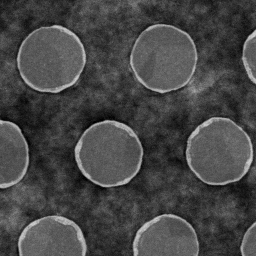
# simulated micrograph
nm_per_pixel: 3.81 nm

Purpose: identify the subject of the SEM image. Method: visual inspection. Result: raised bodies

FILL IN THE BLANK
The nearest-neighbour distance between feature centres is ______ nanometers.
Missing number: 417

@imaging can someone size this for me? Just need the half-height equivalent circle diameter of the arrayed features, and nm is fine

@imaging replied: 252